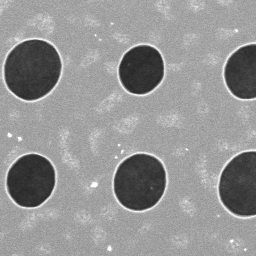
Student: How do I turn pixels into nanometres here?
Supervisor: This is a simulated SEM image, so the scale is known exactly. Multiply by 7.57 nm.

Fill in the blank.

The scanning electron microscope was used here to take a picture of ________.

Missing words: holes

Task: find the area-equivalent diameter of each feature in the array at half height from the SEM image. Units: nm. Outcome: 399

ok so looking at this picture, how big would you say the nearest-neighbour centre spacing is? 109 pixels